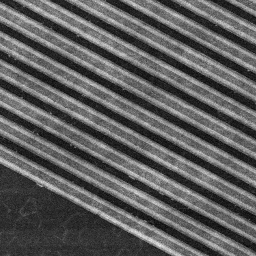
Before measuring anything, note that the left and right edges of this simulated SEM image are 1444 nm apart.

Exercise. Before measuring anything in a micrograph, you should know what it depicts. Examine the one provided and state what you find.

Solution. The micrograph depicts parallel lines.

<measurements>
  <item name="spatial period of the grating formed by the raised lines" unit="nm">141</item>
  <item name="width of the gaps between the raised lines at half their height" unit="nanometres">78.1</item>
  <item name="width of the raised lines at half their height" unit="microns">0.0608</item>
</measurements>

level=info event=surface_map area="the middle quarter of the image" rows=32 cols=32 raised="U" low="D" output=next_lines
DDDDDDUUUUUUDDDDDDDDUUUUUDDDDDDD
UDDDDDDDUUUUUUDDDDDDDDUUUUUDDDDD
UUUDDDDDDDUUUUUUDDDDDDDDUUUUUDDD
UUUUDDDDDDDDUUUUUDDDDDDDDUUUUUUD
DUUUUUDDDDDDDDUUUUUDDDDDDDDUUUUU
DDDUUUUUDDDDDDDDUUUUUDDDDDDDDUUU
DDDDDUUUUUDDDDDDDDUUUUUDDDDDDDDU
DDDDDDUUUUUUDDDDDDDUUUUUUDDDDDDD
UDDDDDDDUUUUUUDDDDDDDUUUUUUDDDDD
UUUDDDDDDDUUUUUUDDDDDDDUUUUUUDDD
UUUUDDDDDDDDUUUUUDDDDDDDDUUUUUDD
DUUUUUDDDDDDDDUUUUUDDDDDDDDUUUUU
DDDUUUUUDDDDDDDDUUUUUDDDDDDDDUUU
DDDDDUUUUUDDDDDDDDUUUUUDDDDDDDDU
DDDDDDUUUUUUDDDDDDDUUUUUUDDDDDDD
DDDDDDDDUUUUUUDDDDDDDUUUUUUDDDDD
UUDDDDDDDDUUUUUUDDDDDDDUUUUUUDDD
UUUUDDDDDDDDUUUUUUDDDDDDDUUUUUUD
DUUUUUDDDDDDDDUUUUUDDDDDDDDUUUUU
DDUUUUUUDDDDDDDDUUUUUDDDDDDDDUUU
DDDDUUUUUUDDDDDDDDUUUUUDDDDDDDDU
DDDDDDUUUUUDDDDDDDDUUUUUUDDDDDDD
DDDDDDDDUUUUUDDDDDDDDUUUUUUDDDDD
UUDDDDDDDDUUUUUDDDDDDDDUUUUUUDDD
UUUUDDDDDDDDUUUUUDDDDDDDDUUUUUUD
UUUUUUDDDDDDDUUUUUUDDDDDDDDUUUUU
DDUUUUUUDDDDDDDDUUUUUDDDDDDDDUUU
DDDDUUUUUUDDDDDDDUUUUUUDDDDDDDDU
DDDDDDUUUUUDDDDDDDDUUUUUDDDDDDDD
DDDDDDDDUUUUUDDDDDDDDUUUUUDDDDDD
UUDDDDDDDDUUUUUDDDDDDDDUUUUUDDDD
UUUUDDDDDDDDUUUUUDDDDDDDDUUUUUDD